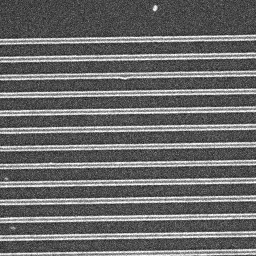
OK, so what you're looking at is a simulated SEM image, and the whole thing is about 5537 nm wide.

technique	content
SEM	parallel lines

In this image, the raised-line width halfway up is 97.3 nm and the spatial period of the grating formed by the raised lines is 386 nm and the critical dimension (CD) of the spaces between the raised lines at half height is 289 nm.